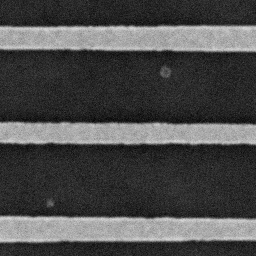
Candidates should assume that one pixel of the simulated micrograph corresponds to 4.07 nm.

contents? lines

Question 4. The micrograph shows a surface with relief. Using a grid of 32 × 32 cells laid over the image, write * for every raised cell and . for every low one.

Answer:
................................
................................
................................
********************************
********************************
********************************
................................
................................
................................
................................
................................
................................
................................
................................
................................
****..***.......................
********************************
********************************
................................
................................
................................
................................
................................
................................
................................
................................
................................
*******************************.
********************************
********************************
................................
................................